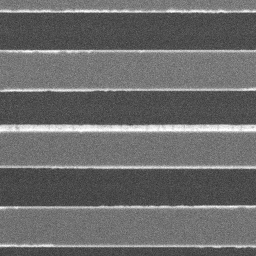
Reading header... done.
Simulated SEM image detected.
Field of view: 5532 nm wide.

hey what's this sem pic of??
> lines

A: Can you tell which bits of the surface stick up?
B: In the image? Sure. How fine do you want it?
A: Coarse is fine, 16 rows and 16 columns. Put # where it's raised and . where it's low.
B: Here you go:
################
................
................
################
################
################
................
................
################
################
...............#
................
................
################
################
................